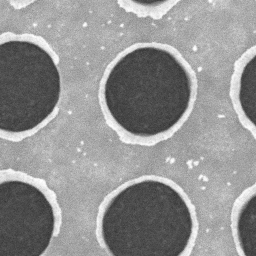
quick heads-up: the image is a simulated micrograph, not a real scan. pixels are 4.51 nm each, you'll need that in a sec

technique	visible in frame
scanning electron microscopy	holes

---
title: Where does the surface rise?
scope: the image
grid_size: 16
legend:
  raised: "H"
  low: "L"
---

HHHHHHHHHHHHHHHH
HHHHHHHHHHHHHHHH
HHHHHHHHHHHHHHHH
LLLHHHHHLLLHHHHH
LLLLHHHLLLLLHHHL
LLLLHHHLLLLLHHHL
LLLHHHHLLLLLHHHL
LLLHHHHLLLLHHHHH
HHHHHHHHHHHHHHHH
HHHHHHHHHHHHHHHH
HHHHHHHHHHHHHHHH
LLHHHHHHLLHHHHHH
LLLHHHHLLLLHHHHH
LLLHHHHLLLLLHHHL
LLLHHHLLLLLLHHHL
LLLHHHHLLLLLHHHL